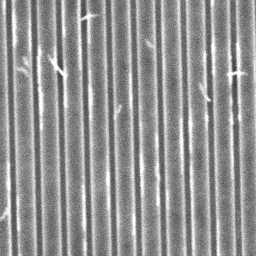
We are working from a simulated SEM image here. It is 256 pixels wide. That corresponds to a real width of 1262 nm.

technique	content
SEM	parallel lines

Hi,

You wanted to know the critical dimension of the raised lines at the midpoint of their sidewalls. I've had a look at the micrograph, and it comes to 93.1 nm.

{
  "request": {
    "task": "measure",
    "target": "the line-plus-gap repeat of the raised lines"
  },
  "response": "123 nm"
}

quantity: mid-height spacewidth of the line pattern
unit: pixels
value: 6